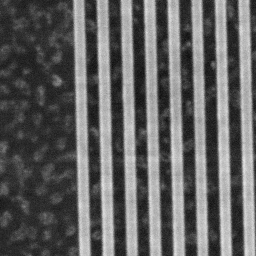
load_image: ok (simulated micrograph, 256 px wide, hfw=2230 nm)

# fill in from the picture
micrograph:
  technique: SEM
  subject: parallel lines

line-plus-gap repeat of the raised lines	205	nm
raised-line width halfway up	90.3	nm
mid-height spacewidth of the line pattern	0.115	microns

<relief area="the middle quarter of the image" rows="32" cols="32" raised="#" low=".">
...##....##....##....##....##...
...##....##....##....##....##...
...##....##....##....##....##...
...##....##....##....##....##...
...##....##....##....##....##...
...##....##....##....##....##...
...##....##....##....##....##...
...##....##....##....##....##...
...###...##....##....##....##...
...###...##....##....##....##...
...###...##....##....##....##...
...###...##....##....##....##...
...###...###...##....##....##...
...###...###...##....##....##...
...###...###...##....##....##...
...###...###...##....##....##...
...###...###...###...##....##...
...###...###...###...##....##...
...###...###...###...##....##...
...###...###...###...##....##...
...###...###...###...###...##...
...###...###...###...###...##...
...###...###...###...###...##...
...###...###...###...###...##...
....##...###...###...###...###..
....##...###...###...###...###..
....##...###...###...###...###..
....##...###...###...###...###..
....##....##...###...###...###..
....##....##...###...###...###..
....##....##...###...###...###..
....##....##...###...###...###..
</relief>